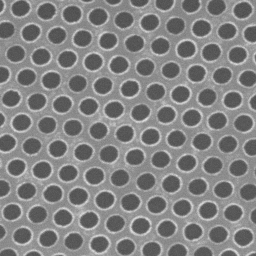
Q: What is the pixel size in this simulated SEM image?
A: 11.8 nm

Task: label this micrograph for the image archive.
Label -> a regular array of holes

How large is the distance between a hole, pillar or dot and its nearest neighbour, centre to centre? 0.301 µm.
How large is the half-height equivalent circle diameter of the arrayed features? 218 nm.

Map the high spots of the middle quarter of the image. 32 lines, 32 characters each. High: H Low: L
LLHHHLLLLLHLLLLLHHLLLLLHHLLLLHHH
HHHHHHLLHHHHLLLLHHLLLLLHLLLLLHHL
HHHHHHHHHHHHHHHHHHHLLLHHLLLLLHHL
HHLLLHHHHLLHHHHHHHHHHHHHHLLLHHHL
HLLLLLHHLLLLHHHLLLHHHHHHHHHHHHHH
HLLLLLHLLLLLHHLLLLLHHLLLLHHHLLHH
HHLLLHHHLLLLHHLLLLLHHLLLLHHLLLLH
HHHHHHHHHLLHHHLLLLHHHLLLLHHLLLLL
LHHHHHLHHHHHHHHHHHHHHLLLLHHLLLLH
LLHHLLLLHHHHLLHHHHHHHHHHHHHHLLHH
LLHHLLLLLHLLLLLHHHLLLHHHHHHHHHHH
LHHHLLLLHHLLLLLHHLLLLLHHLLLLHHHL
HHHHHLLHHHLLLLLHHLLLLHHLLLLLHHLL
HHHHHHHHHHHLLHHHHLLLLHHLLLLLHHLL
LLLLHHHHLHHHHHHHHHHHHHHHLLLHHHLL
LLLLLHHLLLLHHHLLLHHHHHHHHHHHHHHL
LLLLLHLLLLLHHLLLLHHHLLLHHHHHLHHH
LLLLHHLLLLLHHLLLLHHLLLLLHHLLLLHH
HHHHHHHLLLHHHLLLLHHLLLLLHHLLLLLH
HHHHHHHHHHHHHHLLHHHHLLLLHHLLLLHH
LHHLLLLHHHLLHHHHHHHHHHHHHHHLLHHH
LHHLLLLHHLLLLLHHHLLHHHHHHHHHHHHH
HHLLLLLHHLLLLLHHLLLLHHLLLLHHHHHH
HHHLLLLHHLLLLHHLLLLLHHLLLLLHHLLL
HHHHHHHHHHLLHHHHLLLLHHLLLLHHHLLL
LLHHHHHHHHHHHHHHHHHHHHLLLLHHLLLL
LLLHHHLLLLHHHLLHHHHHHHHHHHHHHLLL
LLLLHLLLLLHHLLLLHHHLLLHHHHHHHHHH
LLLHHLLLLLHHLLLLHHLLLLLHHLLLLHHH
LHHHHHLLLHHHLLLLHHLLLLLHHLLLLHHH
HHHHHHHHHHHHHLLHHHLLLLLHLLLLLHHL
HHLLLHHHHHHHHHHHHHHLLHHHHLLLLHHL